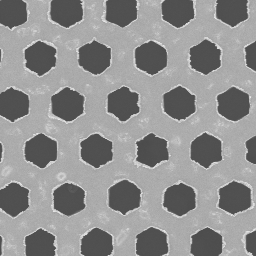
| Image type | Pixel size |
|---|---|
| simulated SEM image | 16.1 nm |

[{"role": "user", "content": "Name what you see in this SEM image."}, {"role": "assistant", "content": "a regular array of holes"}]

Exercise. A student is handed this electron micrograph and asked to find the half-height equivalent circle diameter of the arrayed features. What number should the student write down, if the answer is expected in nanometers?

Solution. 520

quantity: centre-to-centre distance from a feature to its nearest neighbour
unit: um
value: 0.866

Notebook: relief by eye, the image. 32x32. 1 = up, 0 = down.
00011100001110000111000011100001
00011100001110000111000011100001
00011110001110000111100011110001
11111111111111111111111111111111
11111111111111111111111111111111
11110011111001111100111110011110
11100001110000111000011100001110
11100001110000111000011100001110
11110001110001111000111100011110
11111111111111111111111111111111
11111111111111111111111111111111
00011110001111000111100011110011
00001100001110000111000011100001
00001100001110000111100011100001
00011110001111001111100011110001
11111111111111111111111111111111
11111111111111111111111111111111
11110001111000111100011100011110
11100001110000111000011100001110
11100001110000111000011100001110
11110011111001111100111110111111
11111111111111111111111111111111
11111111111111111111111111111111
10011110001111000111100011110001
00001110000111000011100011100001
00001110000111000111000011100001
10011110001111101111100011111011
11111111111111111111111111111111
11111111111111111111111111111111
11110001111000111000011100001110
11100001110000111000011100001110
11100001110000111000011100001110